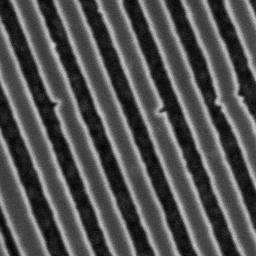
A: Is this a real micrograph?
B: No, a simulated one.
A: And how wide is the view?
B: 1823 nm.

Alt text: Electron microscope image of parallel lines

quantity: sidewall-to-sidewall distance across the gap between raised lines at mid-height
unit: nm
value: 127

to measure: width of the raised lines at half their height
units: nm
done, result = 155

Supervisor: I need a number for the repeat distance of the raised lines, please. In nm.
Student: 283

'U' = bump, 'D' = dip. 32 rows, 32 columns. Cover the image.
DDUUUDDUUUDDUUUDDDUUUDDUUUDDUUUD
DDUUUDDUUUDDDUUUDDUUUDDUUUDDDUUU
DDDUUDDDUUUDDUUUDDUUUDDDUUUDDUUU
DDDUUUDDUUUDDDUUDDDUUUDDUUUDDDUU
UDDUUUDDDUUUDDUUUDDUUUDDDUUDDDUU
UDDDUUUDDUUUDDUUUDDDUUUDDUUUDDUU
UUDDUUUDDUUUDDDUUUDDUUUDDUUUDDDU
UUDDUUUDDDUUUDDUUUDDUUUDDDUUUDDU
UUDDDUUUDDUUUDDUUUDDDUUUDDUUUDDU
UUUDDUUUDDDUUDDDUUUDDUUUDDUUUDDD
UUUDDDUUUDDUUUDDUUUDDDUUDDDUUUDD
DUUUDDUUUDDUUUDDDUUUDDUUUDDUUUDD
DUUUDDDUUDDDUUUDDUUUDDUUUDDUUUDD
DDUUDDDUUUDDUUUDDUUUDDDUUUDDUUUD
DDUUUDDUUUDDDUUDDDUUUDDUUUDDUUUD
DDUUUDDDUUUDDUUUDDUUUDDDUUUDDUUU
DDDUUUDDUUUDDUUUDDDUUUDDUUUDDUUU
DDDUUUDDUUUDDDUUUDDUUUDDUUUDDDUU
UDDUUUDDDUUUDDUUUDDUUUDDDUUUDDUU
UDDDUUUDDUUUDDDUUDDDUUUDDUUUDDDU
UUDDUUUDDDUUUDDUUUDDUUUDDDUUDDDU
UUDDDUUUDDUUUDDUUUDDDUUUDDUUUDDU
UUDDDUUUDDUUUDDDUUUDDUUUDDUUUDDD
UUUDDUUUDDDUUUDDUUUDDUUUDDDUUUDD
UUUDDDUUUDDUUUDDUUUDDDUUUDDUUUDD
UUUUDDUUUDDDUUDDDUUUDDUUUDDUUUDD
UUUUDDDUUUDDUUUDDUUUDDDUUDDDUUUD
DUUUDDDUUUDDUUUDDDUUUDDUUUDDUUUD
DUUUUDDUUUDDDUUUDDUUUDDUUUDDDUUU
DDUUUDDDUUUDDUUUDDDUUDDDUUUDDUUU
DDUUUUDDUUUDDUUUUDDUUUDDUUUDDDUU
UDUUUUDDDUUUDDUUUDDUUUDDDUUDDDUU